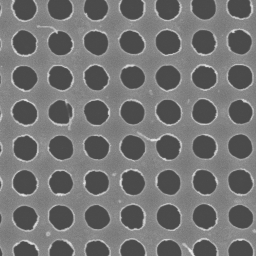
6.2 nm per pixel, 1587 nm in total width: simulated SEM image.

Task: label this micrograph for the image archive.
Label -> a regular array of holes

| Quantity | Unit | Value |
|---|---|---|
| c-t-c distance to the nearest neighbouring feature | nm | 215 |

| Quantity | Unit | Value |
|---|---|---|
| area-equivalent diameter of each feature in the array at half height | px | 24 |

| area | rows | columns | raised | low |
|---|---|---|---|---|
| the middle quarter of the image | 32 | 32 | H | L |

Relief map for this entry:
HHHHHHHLHHHHHHHHHLHHHHHHHLLHHHHH
LHHHHHLLLLHHHHHLLLLLHHHHLLLLHHHH
LLHHHLLLLLLHHHLLLLLLHHHLLLLLLHHH
LLHHHLLLLLLHHHLLLLLLHHHLLLLLLHHH
LLHHHLLLLLLHHHHLLLLLHHHLLLLLLHHH
LLHHHHLLLLHHHHHLLLLHHHHHLLLLHHHH
HHHHHHHHLHHHHHHHHHHHHHHHHHHHHHHH
HHHHHHHHHHHHHHHHHHHHHHHHHHHHHHHH
HHHHHHHHHHHHHHHHHHHHHHHHHHHHHHHH
HHHHHHLLLHHHHHHLLLHHHHHHLLLLHHHH
LLHHHLLLLLLHHHLLLLLLHHHLLLLLLHHH
LLHHHLLLLLLHHHLLLLLLHHHLLLLLLHHH
LLHHHLLLLLLHHHLLLLLLHHHLLLLLLHHH
LHHHHLLLLLLHHHHLLLLLHHHHLLLLLHHH
LHHHHHLLLLHHHHHHLLLHHHHHHLLLHHHH
HHHHHHHHHHHHHHHHHHHHHHHHHHHHHHHH
HHHHHHHHHHHHHHHHHHHHHHHHHHHHHHHH
HHHHHHHHHHHHHHHHHHHHHHHHHHHHHHHH
LHHHHHLLLLHHHHHLLLLHHHHHLLLLHHHH
LLHHHLLLLLLHHHLLLLLLHHHLLLLLLHHH
LLHHHLLLLLLHHHLLLLLLHHHLLLLLLHHH
LLHHHLLLLLLHHHLLLLLLHHHLLLLLLHHH
LLHHHHLLLLLHHHHLLLLLHHHHLLLLLHHH
LHHHHHHLLLHHHHHHLLLHHHHHHLLLHHHH
HHHHHHHHHHHHHHHHHHHHHHHHHHHHHHHH
HHHHHHHHHHHHHHHHHHHHHHHHHHHHHHHH
HHHHHHHHHHHHHHHHHHHHHHHHHHLHHHHH
LHHHHHLLLLHHHHHLLLLHHHHHLLLLHHHH
LLHHHLLLLLLHHHHLLLLLHHHLLLLLLHHH
LLHHHLLLLLLHHHHLLLLLHHHLLLLLLHHH
LLHHHLLLLLLHHHHLLLLLHHHLLLLLLHHH
LLHHHHLLLLLHHHHLLLLLHHHHLLLLLHHH